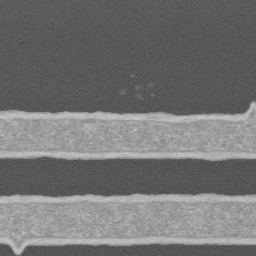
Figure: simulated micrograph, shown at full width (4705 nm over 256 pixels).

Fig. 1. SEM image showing one or a few lines or trenches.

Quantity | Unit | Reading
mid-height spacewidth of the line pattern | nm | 818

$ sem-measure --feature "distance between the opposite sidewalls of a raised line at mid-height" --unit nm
728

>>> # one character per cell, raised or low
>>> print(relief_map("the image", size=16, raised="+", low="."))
................
................
................
................
................
................
................
++++++++++++++++
++++++++++++++++
++++++++++++++++
................
................
.++.+++++++++++.
++++++++++++++++
++++++++++++++++
................